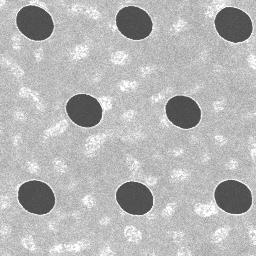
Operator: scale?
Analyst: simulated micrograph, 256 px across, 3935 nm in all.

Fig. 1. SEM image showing a regular array of holes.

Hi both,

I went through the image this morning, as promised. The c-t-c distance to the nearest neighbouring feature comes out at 1520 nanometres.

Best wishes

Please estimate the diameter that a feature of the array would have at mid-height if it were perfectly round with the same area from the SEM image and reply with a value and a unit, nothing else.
547 nm